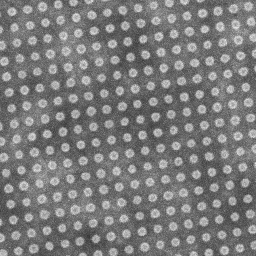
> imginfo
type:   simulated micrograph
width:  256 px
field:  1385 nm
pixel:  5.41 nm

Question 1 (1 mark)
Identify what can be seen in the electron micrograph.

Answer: a regular array of raised bodies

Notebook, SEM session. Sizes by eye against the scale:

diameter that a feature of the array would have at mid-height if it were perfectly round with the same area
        41.4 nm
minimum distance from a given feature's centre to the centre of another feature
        83.5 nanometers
